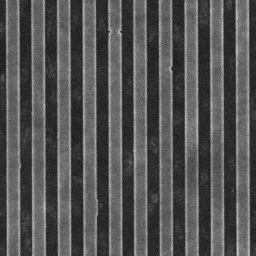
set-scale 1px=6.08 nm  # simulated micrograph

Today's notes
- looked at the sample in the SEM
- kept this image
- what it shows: parallel lines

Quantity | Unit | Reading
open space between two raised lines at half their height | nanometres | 72.9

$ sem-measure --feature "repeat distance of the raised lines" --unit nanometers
155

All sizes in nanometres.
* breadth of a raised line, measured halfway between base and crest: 78.3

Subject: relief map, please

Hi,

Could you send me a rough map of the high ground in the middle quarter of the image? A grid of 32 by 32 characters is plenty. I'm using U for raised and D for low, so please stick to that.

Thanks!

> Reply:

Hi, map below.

UUDDDUUUDDDUUUDDDDUUUDDDUUUDDDUU
UUDDDUUUDDDUUUDDDDUUUDDDUUUDDDUU
UUDDDUUUDDDUUUDDDDUUUDDDUUUDDDUU
UUDDDUUUDDDUUUDDDDUUUDDDUUUDDDUU
UUDDDUUUDDDUUUDDDDUUUDDDUUUDDDUU
UUDDDUUUDDDUUUDDDDUUUDDDUUUDDDUU
UUDDDUUUDDDUUUDDDDUUUDDDUUUDDDUU
UUDDDUUUDDDUUUDDDDUUUDDDUUUDDDUU
UUDDDUUUDDDUUUDDDDUUUDDDUUUDDDUU
UUDDDUUUDDDUUUDDDDUUUDDDUUUDDDUU
UUDDDUUUDDDUUUDDDDUUUDDDUUUDDDUU
UUDDDUUUDDDUUUDDDDUUUDDDUUUDDDUU
UUDDDUUUDDDUUUDDDDUUUDDDUUUDDDUU
UUDDDUUUDDDUUUDDDDUUUDDDUUUDDDUU
UUDDDUUUDDDUUUDDDDUUUDDDUUUDDDUU
UUDDDUUUDDDUUUDDDDUUUDDDUUUDDDUU
UUDDDUUUDDDUUUDDDDUUUDDDUUUDDDUU
UUDDDUUUDDDUUUDDDDUUUDDDUUUDDDUU
UUDDDUUUDDDUUUDDDDUUUDDDUUUDDDUU
UUDDDUUUDDDUUUDDDDUUUDDDUUUDDDDU
UUDDDUUUDDDUUUDDDDUUUDDDUUUDDDDU
UUDDDUUUDDDUUUDDDUUUUDDDUUUDDDDU
UUDDDUUUDDDUUUDDDDUUUDDDUUUDDDDU
UUDDDUUUDDDUUUDDDDUUUDDDUUUDDDDU
UUDDDUUUDDDUUUDDDDUUUDDDUUUDDDDU
UUDDDUUUDDDUUUDDDDUUUDDDUUUDDDDU
UUDDDUUUDDDUUUDDDDUUUDDDUUUDDDUU
UUDDDUUUDDDUUUDDDDUUUDDDUUUDDDUU
UUDDDUUUDDDUUUDDDDUUUDDDUUUDDDUU
UUDDDUUUDDDUUUDDDDUUUDDDUUUDDDDU
UUDDDUUUDDDUUUDDDDUUUDDDUUUDDDDU
UUDDDUUUDDDUUUDDDDUUUDDDUUUDDDDU